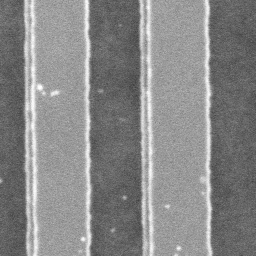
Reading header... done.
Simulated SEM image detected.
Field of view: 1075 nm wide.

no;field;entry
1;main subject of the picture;lines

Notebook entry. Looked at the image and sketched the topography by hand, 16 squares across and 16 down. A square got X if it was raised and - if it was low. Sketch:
--XXX----XXXX---
--XXX----XXXX---
--XXX----XXXX---
--XXXX---XXXX---
--XXX----XXXX---
--XXX----XXXX---
--XXX----XXXX---
--XXXX---XXXX---
--XXXX---XXXX---
--XXXX---XXXX---
--XXXX---XXXX---
--XXXX---XXXX---
--XXXX---XXXX---
--XXXX---XXXX---
--XXXX---XXXX---
--XXXX---XXXX---